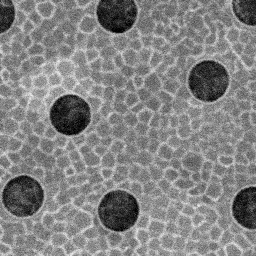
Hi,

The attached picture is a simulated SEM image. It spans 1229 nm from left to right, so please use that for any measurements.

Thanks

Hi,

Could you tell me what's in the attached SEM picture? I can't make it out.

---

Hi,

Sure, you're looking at holes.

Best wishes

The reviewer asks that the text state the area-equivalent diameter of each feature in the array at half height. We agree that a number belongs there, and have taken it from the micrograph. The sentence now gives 208 nm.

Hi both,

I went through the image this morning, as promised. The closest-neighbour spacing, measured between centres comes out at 0.457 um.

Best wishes